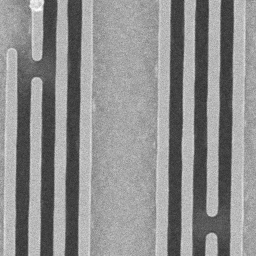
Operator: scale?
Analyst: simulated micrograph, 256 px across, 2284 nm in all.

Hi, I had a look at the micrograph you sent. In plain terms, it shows groups of lines, slits or small figures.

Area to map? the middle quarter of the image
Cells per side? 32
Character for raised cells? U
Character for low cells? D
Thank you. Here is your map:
UDDDUUUDDDDDDDDDDDDDDDDDUUDDDDUU
UDDDUUUDDDDDDDDDDDDDDDDDUUDDDDUU
UDDDUUUDDDDDDDDDDDDDDDDDUUDDDDUU
UDDDUUUDDDDDDDDDDDDDDDDDUUDDDDUU
UDDDUUUDDDDDDDDDDDDDDDDDUUDDDDUU
UDDDUUUDDDDDDDDDDDDDDDDDUUDDDDUU
UDDDUUUDDDDDDDDDDDDDDDDDUUDDDDUU
UDDDUUUDDDDDDDDDDDDDDDDDUUDDDDUU
UDDDUUUDDDDDDDDDDDDDDDDDUUDDDDUU
DDDDUUUDDDDDDDDDDDDDDDDDUUDDDDUU
DDDDUUUDDDDDDDDDDDDDDDDDUUDDDDUU
DDDDUUUDDDDDDDDDDDDDDDDDUUDDDDUU
DDDDUUUDDDDDDDDDDDDDDDDDUUDDDDUU
DDDDUUUDDDDDDDDDDDDDDDDDUUDDDDUU
DDDDUUUDDDDDDDDDDDDDDDDDUUDDDDUU
DDDDUUUDDDDDDDDDDDDDDDDDUUDDDDUU
DDDDUUUDDDDDDDDDDDDDDDDDUUDDDDUU
DDDDUUUDDDDDDDDDDDDDDDDDUUDDDDUU
DDDDUUUDDDDDDDDDDDDDDDDDUUDDDDUU
DDDDUUUDDDDDDDDDDDDDDDDDUUDDDDUU
DDDDUUUDDDDDDDDDDDDDDDDDUUDDDDUU
DDDDUUUDDDDDDDDDDDDDDDDDUUDDDDUU
DDDDUUUDDDDDDDDDDDDDDDDDUUDDDDUU
DDDDUUUDDDDDDDDDDDDDDDDUUUDDDDUU
DDDDUUUDDDDDDDDDDDDDDDDUUUDDDDUU
DDDDUUUDDDDDDDDDDDDDDDDUUUDDDDUU
DDDDUUUDDDDDDDDDDDDDDDDUUUDDDDUU
DDDDUUUDDDDDDDDDDDDDDDDUUUDDDDUU
DDDDUUUDDDDDDDDDDDDDDDDUUUDDDDUU
DDDDUUUDDDDDDDDDDDDDDDDUUUDDDDUU
DDDDUUUDDDDDDDDDDDDDDDDUUUDDDDUU
DDDDUUUDDDDDDDDDDDDDDDDUUUDDDDUU